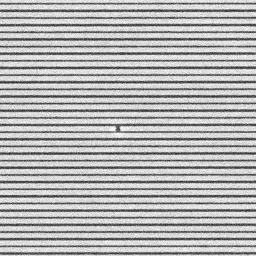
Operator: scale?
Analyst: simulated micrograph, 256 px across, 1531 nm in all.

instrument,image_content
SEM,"parallel lines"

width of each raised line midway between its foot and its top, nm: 30.6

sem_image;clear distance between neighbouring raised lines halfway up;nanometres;15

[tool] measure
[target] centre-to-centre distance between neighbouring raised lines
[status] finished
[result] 0.0427 micrometres